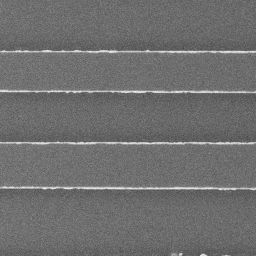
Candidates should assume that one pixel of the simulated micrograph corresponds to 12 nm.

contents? lines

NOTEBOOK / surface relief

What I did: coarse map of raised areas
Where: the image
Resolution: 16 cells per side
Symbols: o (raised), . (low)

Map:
................
................
................
oooooooooooooooo
oooooooooooooooo
oooooooooooooooo
................
................
................
oooooooooooooooo
oooooooooooooooo
oooooooooooooooo
................
................
................
................